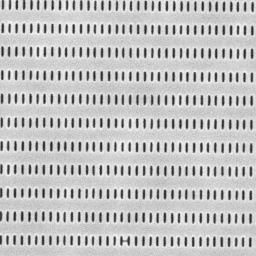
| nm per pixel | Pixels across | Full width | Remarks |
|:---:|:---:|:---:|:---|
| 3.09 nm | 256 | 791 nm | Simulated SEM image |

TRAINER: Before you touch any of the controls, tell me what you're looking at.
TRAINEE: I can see a regular array of holes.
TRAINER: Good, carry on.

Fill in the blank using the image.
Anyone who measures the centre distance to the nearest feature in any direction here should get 6.96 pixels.